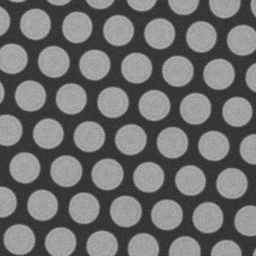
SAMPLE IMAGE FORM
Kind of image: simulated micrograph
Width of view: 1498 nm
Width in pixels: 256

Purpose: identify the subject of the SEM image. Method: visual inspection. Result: an array of small figures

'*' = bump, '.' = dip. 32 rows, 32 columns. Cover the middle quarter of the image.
*...********..********...*******
*...*******...********...*******
.....******....*******...*******
......****.....******....*******
.................**.......*****.
****........................**..
*****.....*****.................
*****....******.....*****.......
******...*******...*******....**
******..********...*******...***
*****...********...*******...***
****.....*******...*******...***
..........*****....*******...***
....................*****.....**
.....**........................*
....*****......****.............
...*******....******.....****...
...*******...*******....******..
..********...********..********.
...*******...*******...********.
...******....*******...********.
....****......*****.....*******.
...............***.......*****..
***........................*....
****....*****...................
****...*******.....*****.......*
****...********...*******....***
****...********...*******...****
****...********..********...****
***....*******....*******...****
**......*****.....******....****
...................****......***